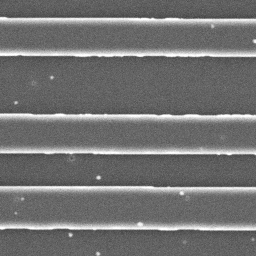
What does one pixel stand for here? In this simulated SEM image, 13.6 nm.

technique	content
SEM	lines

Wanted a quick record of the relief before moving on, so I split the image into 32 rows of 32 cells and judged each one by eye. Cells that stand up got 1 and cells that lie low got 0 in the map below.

00000000000000000000000000000000
00000000000000000000000000000000
11111111111111111111111111111111
11111111111111111111111111111111
11111111111111111111111111111111
11111111111111111111111111111111
11111111111111111111111111111111
00000000000000000000000000000000
00000000000000000000000000000000
00000000000000000000000000000000
00000000000000000000000000000000
00000000000000000000000000000000
00000000000000000000000000000000
00000000000000000000000000000000
11111111111111111111110110011111
11111111111111111111111111111111
11111111111111111111111111111111
11111111111111111111111111111111
11111111111111111111111111111111
00000000000000000000000000000000
00000000000000000000000000000000
00000000000000000000000000000000
00000000000000000000000000000000
11111111111111111111111111111111
11111111111111111111111111111111
11111111111111111111111111111111
11111111111111111111111111111111
11111111111111111111111111111111
10011110111111111111111111111111
00000000000000000000000000000000
00000000000000000000000000000000
00000000000000000000000000000000